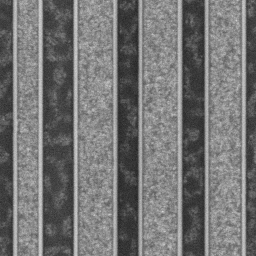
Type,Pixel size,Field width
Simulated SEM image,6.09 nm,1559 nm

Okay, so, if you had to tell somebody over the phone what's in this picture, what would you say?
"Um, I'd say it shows one or a few lines or trenches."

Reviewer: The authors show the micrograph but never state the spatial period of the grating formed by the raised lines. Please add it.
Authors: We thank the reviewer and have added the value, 65.5 px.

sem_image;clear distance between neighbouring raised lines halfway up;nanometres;159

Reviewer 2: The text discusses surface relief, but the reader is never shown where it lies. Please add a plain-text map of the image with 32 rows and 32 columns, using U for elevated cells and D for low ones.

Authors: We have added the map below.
DDUUUDDDDUUUUUDDDDUUUUDDDDUUUUDD
DDUUUDDDDUUUUUDDDDUUUUDDDDUUUUDD
DDUUUDDDDUUUUUDDDDUUUUDDDDUUUUDD
DDUUUDDDDUUUUUDDDDUUUUDDDDUUUUDD
DDUUUDDDDUUUUUDDDDUUUUDDDDUUUUDD
DDUUUDDDDUUUUUDDDDUUUUDDDDUUUUDD
DDUUUDDDDUUUUUDDDDUUUUUDDDUUUUDD
DDUUUDDDDUUUUUDDDDUUUUUDDDUUUUDD
DDUUUDDDDUUUUUDDDDUUUUUDDDUUUUDD
DDUUUDDDDUUUUUDDDDUUUUUDDDUUUUDD
DDUUUDDDDUUUUUDDDDUUUUDDDDUUUUDD
DDUUUDDDDUUUUUDDDDUUUUDDDDUUUUDD
DDUUUDDDDUUUUUDDDDUUUUDDDDUUUUDD
DDUUUDDDDUUUUUDDDDUUUUDDDDUUUUDD
DDUUUDDDDUUUUUDDDDUUUUDDDDUUUUDD
DDUUUDDDDUUUUUDDDDUUUUDDDDUUUUDD
DDUUUDDDDUUUUUDDDDUUUUDDDDUUUUDD
DDUUUDDDDUUUUUDDDDUUUUDDDDUUUUDD
DDUUUDDDDUUUUUDDDDUUUUDDDDUUUUDD
DDUUUDDDDUUUUUDDDDUUUUDDDDUUUUDD
DDUUUDDDDUUUUUDDDDUUUUDDDDUUUUDD
DDUUUDDDDUUUUUDDDDUUUUDDDDUUUUDD
DDUUUDDDDUUUUUDDDDUUUUDDDDUUUUDD
DDUUUDDDDUUUUUDDDDUUUUDDDDUUUUDD
DDUUUDDDDUUUUUDDDDUUUUDDDDUUUUDD
DDUUUDDDDUUUUUDDDDUUUUDDDDUUUUDD
DDUUUDDDDUUUUUDDDDUUUUDDDDUUUUDD
DDUUUDDDDUUUUUDDDDUUUUDDDDUUUUDD
DDUUUDDDDUUUUUDDDDUUUUDDDDUUUUDD
DDUUUDDDDUUUUUDDDDUUUUDDDDUUUUDD
DDUUUDDDDUUUUUDDDDUUUUDDDDUUUUDD
DDUUUDDDDUUUUUDDDDUUUUDDDDUUUUDD